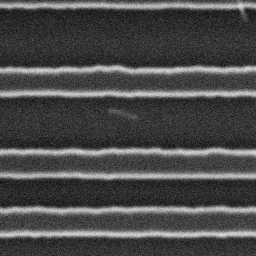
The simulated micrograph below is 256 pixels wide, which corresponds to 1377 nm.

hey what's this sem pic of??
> lines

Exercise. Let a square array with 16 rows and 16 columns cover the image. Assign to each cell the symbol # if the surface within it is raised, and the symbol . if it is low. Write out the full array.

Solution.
................
................
................
................
################
################
................
................
................
################
################
................
................
################
################
................